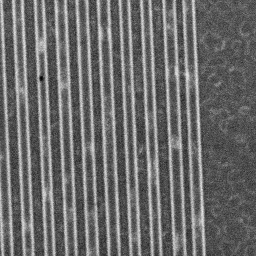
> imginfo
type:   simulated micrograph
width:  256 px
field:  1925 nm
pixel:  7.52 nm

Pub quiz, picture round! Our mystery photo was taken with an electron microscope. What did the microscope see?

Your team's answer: parallel lines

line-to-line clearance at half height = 83.6 nm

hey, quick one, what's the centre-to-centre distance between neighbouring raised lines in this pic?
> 160 nm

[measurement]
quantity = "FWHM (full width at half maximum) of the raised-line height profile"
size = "10.2 px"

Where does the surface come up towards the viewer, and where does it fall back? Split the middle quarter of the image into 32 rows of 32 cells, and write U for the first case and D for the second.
UDDDUUDDDUUUDDDUUDDDUUDDDDUUDDDU
UDDDUUDDDUUUDDDUUDDDUUDDDDUUDDDU
UDDDUUUDDUUUDDDUUDDDUUDDDDUUDDDU
UDDDUUUDDUUUDDDUUDDDUUDDDDUUDDDU
UDDDUUUDDUUUDDDUUDDDUUDDDDUUUDDU
UDDDUUUDDUUUDDDUUDDDUUDDDDUUUDDU
UDDDUUUDDUUUDDDUUDDDUUDDDDUUUDDU
UDDDUUUDDUUUDDDUUDDDUUDDDDUUUDDU
UDDDUUUDDDUUDDDUUDDDUUUDDDUUUDDU
UDDDUUUDDDUUDDDUUDDDUUUDDDUUUDDU
UUDDUUUDDDUUDDDUUDDDUUUDDDUUUDDU
UUDDUUUDDDUUDDDUUDDDDUUDDDUUUDDU
UUDDUUUDDDUUDDDUUDDDDUUDDDUUUDDU
UUDDUUUDDDUUDDDUUDDDDUUDDDUUUDDU
UUDDUUUDDDUUDDDUUDDDDUUDDDUUUDDU
UUDDDUUDDDUUDDDUUDDDDUUDDDUUUDDU
UUDDDUUDDDUUDDDUUUDDDUUDDDUUUDDU
UUDDDUUDDDUUDDDUUUDDDUUDDDUUUDDU
UUDDDUUDDDUUUDDDUUDDDUUDDDUUUDDU
UUDDDUUDDDUUUDDDUUDDDUUDDDUUUDDD
UUDDDUUDDDUUUDDDUUDDDUUDDDUUUDDD
UUDDDUUDDDUUUDDDUUDDDUUDDDUUUDDU
UUDDDUUDDDUUUDDDUUDDDUUDDDDUUDDU
UUDDDUUDDDUUUDDDUUDDDUUDDDDUUDDU
UUDDDUUDDDUUUDDDUUDDDUUDDDDUUDDD
UUDDDUUDDDUUUDDDUUDDDUUDDDDUUDDD
UUDDDUUUDDUUUDDDUUDDDUUDDDDUUDDD
UUDDDUUUDDUUUDDDUUDDDUUDDDDUUUDD
UUDDDUUUDDUUUDDDUUDDDUUDDDDUUUDD
UUDDDUUUDDUUUDDDUUDDDUUDDDDUUUDD
UUDDDUUUDDUUUDDDUUDDDUUDDDDUUUDD
UUDDDUUUDDDUUDDDUUDDDUUUDDDUUUDD